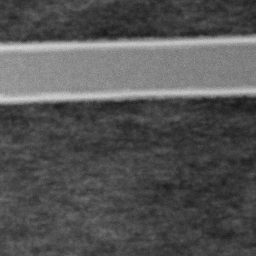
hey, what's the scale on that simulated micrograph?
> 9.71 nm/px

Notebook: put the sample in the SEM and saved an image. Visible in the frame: one or a few lines or trenches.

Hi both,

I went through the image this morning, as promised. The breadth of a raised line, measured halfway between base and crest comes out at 491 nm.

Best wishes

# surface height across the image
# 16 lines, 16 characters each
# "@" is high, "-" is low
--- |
----------------
----------------
----------------
@@@@@@@@@@@@@@@@
@@@@@@@@@@@@@@@@
@@@@@@@@@@@@@@@@
----------------
----------------
----------------
----------------
----------------
----------------
----------------
----------------
----------------
----------------